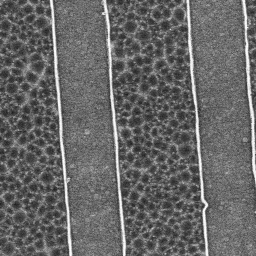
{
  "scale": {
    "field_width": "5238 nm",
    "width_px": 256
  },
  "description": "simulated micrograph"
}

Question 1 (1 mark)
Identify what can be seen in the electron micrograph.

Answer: one or a few lines or trenches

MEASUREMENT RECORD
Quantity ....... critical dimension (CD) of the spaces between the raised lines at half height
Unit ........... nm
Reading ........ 1120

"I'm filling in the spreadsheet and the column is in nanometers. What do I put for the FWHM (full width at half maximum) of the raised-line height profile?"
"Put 1670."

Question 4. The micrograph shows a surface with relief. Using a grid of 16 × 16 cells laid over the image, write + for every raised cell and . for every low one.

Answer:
+++....+++++...+
+++....+++++...+
+++....+++++...+
+++....+++++...+
++++...+++++...+
++++...+++++....
++++...+++++....
++++...+++++....
++++...+++++....
++++...+++++....
++++...++++++...
++++...++++++...
++++....+++++...
++++....+++++...
++++....+++++...
++++....+++++...